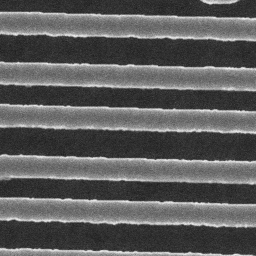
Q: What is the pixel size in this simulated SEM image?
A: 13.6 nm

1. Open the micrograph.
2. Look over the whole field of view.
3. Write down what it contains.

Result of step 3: lines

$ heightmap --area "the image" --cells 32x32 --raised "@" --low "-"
--------------------------@-----
--------------------------------
@@@@@@@@@@@@@@@@@@@@@@@@@@@@@@@@
@@@@@@@@@@@@@@@@@@@@@@@@@@@@@@@@
---------@@--@@@@@@@@@@@@@@@@@@@
--------------------------------
--------------------------------
--------------------------------
@@@@@@@@@@@@@@@@@@@@@@@@@@@@@@@-
@@@@@@@@@@@@@@@@@@@@@@@@@@@@@@@@
--@@@@@@@@@@@@@@@@@@@@@@@@@@@@@@
--------------------------------
--------------------------------
@@@@@@@@@@@@@@------------------
@@@@@@@@@@@@@@@@@@@@@@@@@@@@@@@@
@@@@@@@@@@@@@@@@@@@@@@@@@@@@@@@@
---------------------------@@@@@
--------------------------------
--------------------------------
@-@-----------------------------
@@@@@@@@@@@@@@@@@@@@@@@@@@@@@@@@
@@@@@@@@@@@@@@@@@@@@@@@@@@@@@@@@
--------------@@@@@@@@@@@@@@@@@@
--------------------------------
--------------------------------
@@@@@@@@@@@@@@@@@@@@@@@@@@@@@---
@@@@@@@@@@@@@@@@@@@@@@@@@@@@@@@@
--@@@@@@@@@@@@@@@@@@@@@@@@@@@@@@
--------------------------------
--------------------------------
--------------------------------
@@@@@@@@@@@@@@@@@@--------------